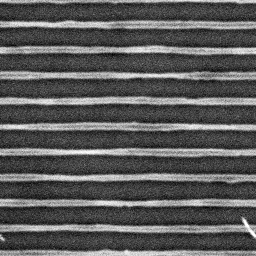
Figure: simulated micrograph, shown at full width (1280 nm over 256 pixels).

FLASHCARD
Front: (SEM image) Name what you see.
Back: parallel lines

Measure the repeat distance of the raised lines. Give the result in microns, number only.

0.127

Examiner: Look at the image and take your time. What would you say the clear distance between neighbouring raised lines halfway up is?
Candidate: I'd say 100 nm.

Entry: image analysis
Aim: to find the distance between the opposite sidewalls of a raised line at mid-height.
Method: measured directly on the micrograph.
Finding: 25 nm